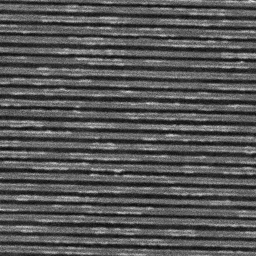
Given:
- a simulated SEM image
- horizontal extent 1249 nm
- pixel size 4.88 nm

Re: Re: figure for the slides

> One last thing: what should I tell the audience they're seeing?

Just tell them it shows parallel lines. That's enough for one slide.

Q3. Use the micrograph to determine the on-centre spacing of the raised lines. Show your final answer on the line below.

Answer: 51.3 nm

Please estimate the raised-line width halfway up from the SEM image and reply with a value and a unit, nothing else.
5.49 px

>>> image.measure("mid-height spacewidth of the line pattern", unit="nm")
22.5